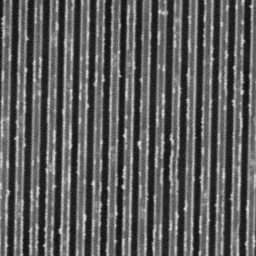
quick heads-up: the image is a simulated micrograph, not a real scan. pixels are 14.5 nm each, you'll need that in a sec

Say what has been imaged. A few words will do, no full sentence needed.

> parallel lines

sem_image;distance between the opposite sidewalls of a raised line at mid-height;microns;0.108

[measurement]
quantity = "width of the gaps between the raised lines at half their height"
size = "0.107 micrometres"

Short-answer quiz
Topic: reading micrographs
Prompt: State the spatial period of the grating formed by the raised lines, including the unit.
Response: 224 nm